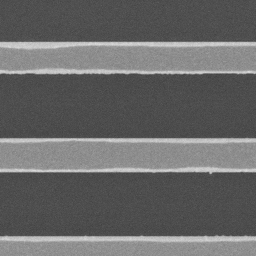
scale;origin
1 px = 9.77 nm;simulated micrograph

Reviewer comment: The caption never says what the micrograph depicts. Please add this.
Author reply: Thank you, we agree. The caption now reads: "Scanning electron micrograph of lines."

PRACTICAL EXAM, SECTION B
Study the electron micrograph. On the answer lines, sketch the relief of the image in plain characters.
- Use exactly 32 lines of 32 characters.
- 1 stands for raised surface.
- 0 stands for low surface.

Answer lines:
00000000000000000000000000000000
00000000000000000000000000000000
00000000000000000000000000000000
00000000000000000000000000000000
00000000000000000000000000000000
00000000111111111111001111111111
11111111111111111111111111111111
11111111111111111111111111111111
11111111111111111111111111111111
00000000000000000000000000000000
00000000000000000000000000000000
00000000000000000000000000000000
00000000000000000000000000000000
00000000000000000000000000000000
00000000000000000000000000000000
00000000000000000000000000000000
00000000000000000000000000000000
11111111111111111111111111111111
11111111111111111111111111111111
11111111111111111111111111111111
11111111111111111111111111111111
00000000000000000000000000000000
00000000000000000000000000000000
00000000000000000000000000000000
00000000000000000000000000000000
00000000000000000000000000000000
00000000000000000000000000000000
00000000000000000000000000000000
00000000000000000000000000000000
00000000000000000000000000000000
11111111111111111111111111111111
11111111111111111111111111111111